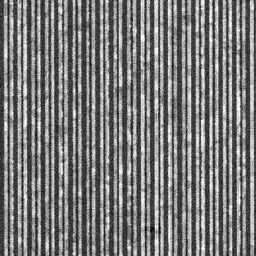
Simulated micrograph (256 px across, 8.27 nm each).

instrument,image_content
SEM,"parallel lines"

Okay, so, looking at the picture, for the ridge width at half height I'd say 21.7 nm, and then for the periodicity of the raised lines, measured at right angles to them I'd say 56.5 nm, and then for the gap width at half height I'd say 0.0346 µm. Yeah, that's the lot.